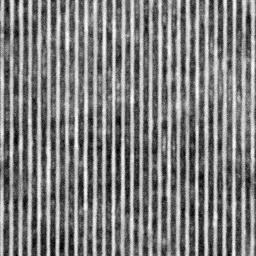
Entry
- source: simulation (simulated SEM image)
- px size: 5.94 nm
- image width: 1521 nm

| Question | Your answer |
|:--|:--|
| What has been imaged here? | parallel lines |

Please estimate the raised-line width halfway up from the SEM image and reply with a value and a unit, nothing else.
19.3 nm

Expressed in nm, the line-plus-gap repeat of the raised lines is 55.1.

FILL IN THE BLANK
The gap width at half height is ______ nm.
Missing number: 38.6